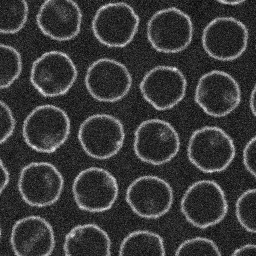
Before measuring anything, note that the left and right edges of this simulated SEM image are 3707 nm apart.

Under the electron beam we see a regular array of raised bodies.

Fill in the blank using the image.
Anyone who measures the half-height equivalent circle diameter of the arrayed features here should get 0.633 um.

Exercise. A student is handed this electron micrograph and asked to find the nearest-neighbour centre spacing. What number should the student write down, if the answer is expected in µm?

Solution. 0.795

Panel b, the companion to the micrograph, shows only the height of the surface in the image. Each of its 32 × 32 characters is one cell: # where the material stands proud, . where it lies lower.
###...###.......................
###..#####..#####...##..........
###..#####..#####..#####...##...
##...#####..#####..#####..#####.
......###...#####..#####..#####.
.............###...####...#####.
##........................####..
##...####....#..................
##..#####..#####....#...........
##..#####..#####..#####...###...
#...#####..#####..#####..####...
.....###...#####..#####..#####..
.............#.....###...#####.#
#....##..................####...
#...####........................
##.######.#####...###...........
#..#####..#####..#####...###....
...#####..#####..#####..#####...
....###....####..#####..#####..#
............##...#####..#####..#
.....#..................####...#
#..####...###..................#
#..#####..####...###............
...#####.######.#####...###.....
...####..#####..#####..#####..##
....##....####..#####..#####..##
.................####..#####..##
...##...................###...##
..####....##...................#
..#####..####...####............
..#####.######.#####...####.....
..####..######.#####..#####...##